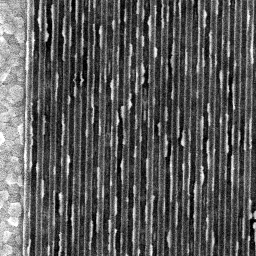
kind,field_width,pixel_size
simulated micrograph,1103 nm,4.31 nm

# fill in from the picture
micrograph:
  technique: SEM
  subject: parallel lines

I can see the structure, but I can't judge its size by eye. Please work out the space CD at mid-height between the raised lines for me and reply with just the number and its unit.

22.6 nm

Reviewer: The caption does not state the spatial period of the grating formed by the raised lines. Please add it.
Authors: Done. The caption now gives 52.5 nm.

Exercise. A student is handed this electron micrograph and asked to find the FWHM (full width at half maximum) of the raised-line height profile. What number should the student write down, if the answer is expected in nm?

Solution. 30.7